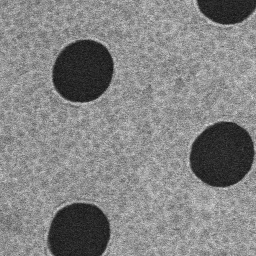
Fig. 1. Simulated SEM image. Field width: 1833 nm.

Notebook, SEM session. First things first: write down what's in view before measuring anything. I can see holes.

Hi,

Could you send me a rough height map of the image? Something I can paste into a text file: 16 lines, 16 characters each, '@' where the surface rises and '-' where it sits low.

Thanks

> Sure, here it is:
@@@@@@@@@@@@----
@@@@@@@@@@@@@@@@
@@@@@@@@@@@@@@@@
@@@@---@@@@@@@@@
@@@----@@@@@@@@@
@@@----@@@@@@@@@
@@@@@@@@@@@@@@@@
@@@@@@@@@@@@@@@@
@@@@@@@@@@@@----
@@@@@@@@@@@@----
@@@@@@@@@@@@----
@@@@@@@@@@@@@--@
@@@@@@@@@@@@@@@@
@@@----@@@@@@@@@
@@@----@@@@@@@@@
@@@----@@@@@@@@@